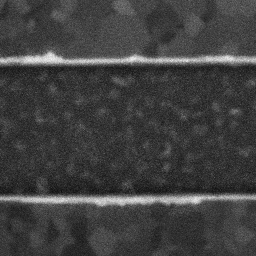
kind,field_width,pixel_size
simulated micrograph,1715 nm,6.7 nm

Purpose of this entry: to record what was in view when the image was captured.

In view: one or a few lines or trenches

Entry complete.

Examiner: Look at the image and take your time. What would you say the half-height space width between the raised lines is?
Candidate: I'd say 920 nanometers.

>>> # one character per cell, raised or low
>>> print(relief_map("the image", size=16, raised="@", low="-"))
@@@@@@@@@@@@@@@@
@@@@@@@@@@@@@@@@
@@@@@@@@@@@@@@@@
@@@@@@@@@@@@@@@@
----------------
----------------
----------------
----------------
----------------
----------------
----------------
----------------
@@@@@@@@@@@@@@@@
@@@@@@@@@@@@@@@@
@@@@@@@@@@@@@@@@
@@@@@@@@@@@@@@@@